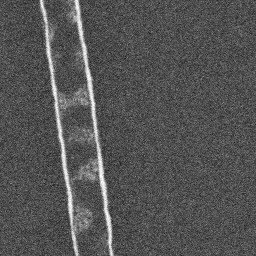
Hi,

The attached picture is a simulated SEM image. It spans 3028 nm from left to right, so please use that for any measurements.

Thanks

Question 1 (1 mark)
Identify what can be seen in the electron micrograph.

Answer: one or a few lines or trenches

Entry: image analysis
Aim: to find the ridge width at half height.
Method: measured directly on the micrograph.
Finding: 419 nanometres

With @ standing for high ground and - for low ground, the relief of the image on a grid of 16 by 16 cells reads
---@@-----------
---@@-----------
---@@-----------
---@@-----------
---@@@----------
---@@@----------
----@@----------
----@@----------
----@@----------
----@@----------
----@@----------
----@@----------
----@@@---------
----@@@---------
-----@@---------
-----@@---------